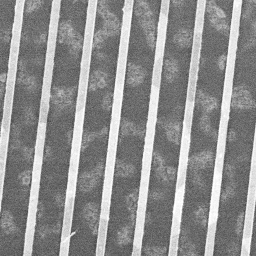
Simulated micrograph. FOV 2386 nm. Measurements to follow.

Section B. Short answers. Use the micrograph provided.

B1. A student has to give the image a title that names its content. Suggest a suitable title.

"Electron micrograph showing parallel lines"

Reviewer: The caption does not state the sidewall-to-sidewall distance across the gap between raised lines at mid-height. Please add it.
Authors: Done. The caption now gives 263 nm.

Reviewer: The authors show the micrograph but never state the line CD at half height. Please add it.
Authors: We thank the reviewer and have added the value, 71.8 nm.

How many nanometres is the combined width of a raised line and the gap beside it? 336